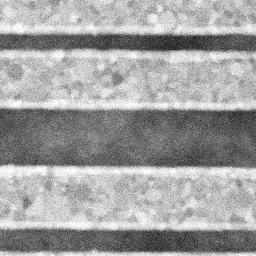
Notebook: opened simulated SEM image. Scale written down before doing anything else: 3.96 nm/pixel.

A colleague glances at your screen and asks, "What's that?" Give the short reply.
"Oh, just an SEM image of one or a few lines or trenches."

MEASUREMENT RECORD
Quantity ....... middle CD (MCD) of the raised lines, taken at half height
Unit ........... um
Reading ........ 0.208